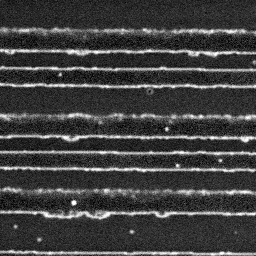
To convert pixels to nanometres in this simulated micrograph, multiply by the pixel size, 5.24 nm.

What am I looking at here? lines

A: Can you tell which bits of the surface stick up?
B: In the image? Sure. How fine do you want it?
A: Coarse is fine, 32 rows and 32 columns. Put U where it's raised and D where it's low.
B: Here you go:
DDDDDDDDDDDDDDDDDDDDDDDDDDDDDDDD
DDDDDDDDDDDDDDDDDDDDDDDDDDDDDDDD
DDDDDDDDDDDDDDDDDDDDDDDDDDDDDDDD
DDDDDDDDDDDDDDDDDDDDDDDDDDDDDDDD
UUUUUUUUUUUUUUUUUUUUUUUUUUUUUUUU
UUUUUUUUUUUUUUUUUUUUUUUUUUUUUUUU
DUDDDDDDUUUUUUUUUUDDDUUUUUUUUUUU
DDDDDDDDDDDDDDDDDDDDDDDDDDDDDDDD
UDDDDDDDDDDDDDDDDDDDDDDDDDDDDDDD
UUUUUUUUUUUUUUUUUUUUUUUUUUUUUUUU
UUUUUUUUUUUUUUUUUUUUUUUUUUUUUUUU
DDDDDDDDDDDDDDDDDDDDDDDDDDDDDDDD
DDDDDDDDDDDDDDDDDDDDDDDDDDDDDDDD
DDDDDDDDDDDDDDDDDDDDDDDDDDDDDDDD
UUUUUUUUUUUDDDUUUUUUDDDUUUDDDDDD
UUUUUUUUUUUUUUUUUUUUUUUUUUUUUUUU
UUUUUUUUUUUUUUUUUUUUUUUUUUUUUUUU
DDDDDDDDUDDDDDDDDDDDDDDDDDDDDDUD
DDDDDDDDDDDDDDDDDDDDDDDDDDDDDDDD
UUUUUUUUUUUUUUUUUUUUUUUUUUUUUUUU
UUUUUUUUUUUUUUUUUUUUUUUUUUUUUUUU
DDDDDDDDDDDDDDDDDDDDDDDDDDDDDDDD
DDDDDDDDDDDDDDDDDDDDDDDDDDDDDDDD
DDDDDDDDDDDDDDDDDDDDDDDDDDDDDDDD
UUUUUUUUUUUUUUUUUUUUUUUUUUUUUUUU
UUUUUUUUUUUUUUUUUUUUUUUUUUUUUUUU
UUUUUUUUUUUUUUUUUUUUUUUUUUUUUUUU
DDDDDDDDDDDDDDDDDDDDDDDDDDDDDDDD
DDDDDDDDDDDDDDDDDDDDDDDDDDDDDDDD
DDDDDDDDDDDDDDDDDDDDDDDDDDDDDDDD
DDDDDDDDDDDDDDDDDDDDDDDDDDDDDDDD
UUUUUDDUDUDDDDDDDDDDDDDDDDDDDDDD